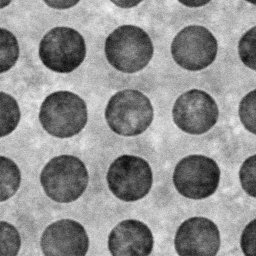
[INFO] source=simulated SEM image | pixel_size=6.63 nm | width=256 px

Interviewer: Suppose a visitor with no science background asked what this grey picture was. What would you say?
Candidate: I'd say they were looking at a regular array of holes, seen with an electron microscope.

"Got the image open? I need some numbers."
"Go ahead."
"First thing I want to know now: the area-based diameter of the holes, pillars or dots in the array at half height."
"316 nanometers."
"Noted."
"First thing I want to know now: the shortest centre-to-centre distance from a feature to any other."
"64.3 pixels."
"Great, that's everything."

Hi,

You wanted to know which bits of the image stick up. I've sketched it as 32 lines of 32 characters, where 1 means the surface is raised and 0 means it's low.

01111100001111000111111000111110
11111111111111111111111111111111
11111111111111111111111111111111
01111110011111100011111000111110
00111000001110000001110000011100
00111000000110000001100000011100
00111000000110000001100000011100
00111000001110000001110000011100
01111100001111000011111000111110
11111111111111111111111111111111
11111111111111111111111111111111
01111110011111100011111000111110
00111000001111000001110000011100
00111000000110000001110000011100
00011000000110000001110000011100
00111000000110000001110000011100
00111100001111000011111000111110
11111111111111111111111111111111
11111111111111111111111111111111
01111110011111100111111000111110
00111100001111000001110000011100
00011000000110000001110000011100
00011000000110000001110000011100
00111000000111000001110000011100
00111100001111000011111000111110
11111111111111111111111111111111
11111111111111111111111111111111
11111110011111110111111000111110
00111100000111000001110000011100
00111000000111000001110000001100
00011000000110000001110000001100
00111000000111000001110000011100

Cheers